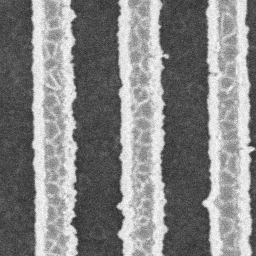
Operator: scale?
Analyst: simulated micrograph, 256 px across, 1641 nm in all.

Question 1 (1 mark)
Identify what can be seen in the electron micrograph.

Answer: one or a few lines or trenches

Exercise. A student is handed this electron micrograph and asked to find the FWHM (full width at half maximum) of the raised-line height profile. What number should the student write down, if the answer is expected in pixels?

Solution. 31.4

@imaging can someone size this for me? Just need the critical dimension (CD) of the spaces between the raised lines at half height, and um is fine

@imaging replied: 0.358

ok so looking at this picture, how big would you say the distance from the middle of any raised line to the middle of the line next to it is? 0.558 µm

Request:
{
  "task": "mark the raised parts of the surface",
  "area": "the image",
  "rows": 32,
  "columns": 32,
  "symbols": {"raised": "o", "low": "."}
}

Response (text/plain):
.....ooo........oooo.......ooo..
.....ooo.......oooo.......oooo..
.....ooo.......oooo........ooo..
.....oooo......oooo.......oooo..
.....oooo......oooo........ooo..
.....oooo......oooo........ooo..
.....ooo.......ooooo......oooo..
.....oooo......ooooo.......ooo..
.....oooo.......oooo.......ooo..
.....oooo.......oooo.......oooo.
.....oooo.......oooo.......ooo..
.....oooo.......ooo........ooo..
.....oooo.......oooo.......ooo..
.....oooo.......oooo.......ooo..
.....oooo.......oooo.......oooo.
.....oooo.......oooo......oooo..
.....oooo.......oooo.......ooo..
.....oooo.......oooo.......oooo.
.....oooo.......oooo.......oooo.
.....oooo.......oooo.......oooo.
.....oooo.......oooo.......oooo.
.....oooo.......ooo........oooo.
.....oooo.......oooo.......oooo.
.....oooo.......oooo.......oooo.
.....oooo.......oooo.......oooo.
.....oooo......ooooo......ooooo.
.....oooo.......oooo.......oooo.
.....oooo.......oooo.......oooo.
.....oooo.......oooo.......oooo.
.....oooo.......oooo.......oooo.
.....oooo.......oooo.......oooo.
.....oooo.......oooo.......oooo.